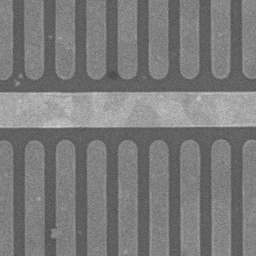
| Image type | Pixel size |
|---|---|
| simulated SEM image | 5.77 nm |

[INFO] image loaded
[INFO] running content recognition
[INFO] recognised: groups of lines, slits or small figures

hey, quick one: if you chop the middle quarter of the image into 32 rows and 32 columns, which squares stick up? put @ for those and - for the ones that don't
@@----@@@@----@@@@---@@@@@---@@@
@@----@@@@----@@@@---@@@@@---@@@
@@----@@@@----@@@@----@@@@----@@
@------@@------@@------@@-----@@
--------------------------------
--------------------------------
--------------------------------
----@@@@@@@@@@@@@@@@@@@@@@@@@@@@
@@@@@@@@@@@@@@@@@@@@@@@@@@@@@@@@
@@@@@@@@@@@@@@@@@@@@@@@@@@@@@@@@
@@@@@@@@@@@@@@@@@@@@@@@@@@@@@@@@
@@@@@@@@@@@@@@@@@@@@@@@@@@@@@@@@
@@@@@@@@@@@@@@@@@@@@@@@@@@@@@@@@
@@@@@@@@@@@@@@@@@@@@@@@@@@@@@@@@
@@@@@@@@@@@@@@@@@@@@@@@@@@@@@@@@
@@@@@@@@@@@@@@@-----------------
--------------------------------
--------------------------------
--------------------------------
@@-----@@------@@------@@-----@@
@@----@@@@----@@@@----@@@@----@@
@@@---@@@@----@@@@----@@@@---@@@
@@@---@@@@----@@@@----@@@@---@@@
@@@---@@@@----@@@@----@@@@---@@@
@@@---@@@@----@@@@----@@@@---@@@
@@@---@@@@----@@@@----@@@@---@@@
@@@---@@@@----@@@@----@@@@---@@@
@@@---@@@@----@@@@----@@@@---@@@
@@@---@@@@----@@@@---@@@@@---@@@
@@@---@@@@----@@@@---@@@@@---@@@
@@@---@@@@----@@@@---@@@@@---@@@
@@@---@@@@----@@@@----@@@@---@@@